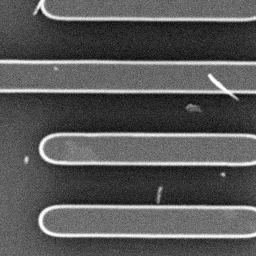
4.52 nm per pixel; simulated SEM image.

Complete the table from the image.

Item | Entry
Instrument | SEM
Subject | groups of lines, slits or small figures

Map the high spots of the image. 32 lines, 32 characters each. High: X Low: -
-----XXXXXXXXXXXXXXXXXXXXXXXXXXX
------XXXXXXXXXXXXXXXXXXXXXXXXXX
--------------------------------
--------------------------------
--------------------------------
--------------------------------
--------------------------------
--------------------------------
XXXXXXXXXXXXXXXXXXXXXXXXXXXXXXXX
XXXXXXXXXXXXXXXXXXXXXXXXXXXXXXXX
XXXXXXXXXXXXXXXXXXXXXXXXXXXXXXXX
-------------------------XXXXXXX
--------------------------------
--------------------------------
--------------------------------
--------------------------------
--------------------------------
------XXXXXXXXXXXXXXXXXXXXXXXXXX
-----XXXXXXXXXXXXXXXXXXXXXXXXXXX
-----XXXXXXXXXXXXXXXXXXXXXXXXXXX
-----------------XXXXXXXXXXXXXXX
--------------------------------
--------------------------------
--------------------------------
--------------------------------
--------------------------------
------XXXXXXXXXXXXXXXXXXXXXXXXXX
-----XXXXXXXXXXXXXXXXXXXXXXXXXXX
-----XXXXXXXXXXXXXXXXXXXXXXXXXXX
--------XXXXXXXXXXXXXXXXXXXXXXXX
--------------------------------
--------------------------------